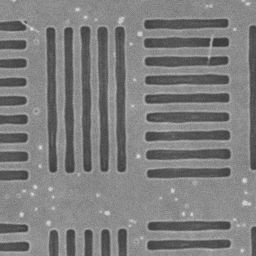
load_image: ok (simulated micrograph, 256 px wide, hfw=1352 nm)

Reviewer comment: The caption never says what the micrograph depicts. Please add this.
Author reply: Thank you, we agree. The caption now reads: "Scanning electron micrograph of groups of lines, slits or small figures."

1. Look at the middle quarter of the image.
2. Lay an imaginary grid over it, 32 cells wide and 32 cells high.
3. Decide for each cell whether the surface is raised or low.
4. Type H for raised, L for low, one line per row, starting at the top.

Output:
LLHHLLLHLLLHHLLHHHHHHLLLLLLLLLLL
LLHHLLLHLLLHHLLHHHHHHHHHHHHHHHHH
LLHHLLLHLLLHHLLLHHHHHHHHHHHHHHHH
LLHHLLLHHLLHHLLLHHHHLLLLLLLLLLLL
LLHHLLLHHLLHHLLHHHHHLLLLLLLLLLLL
LLHHLLLHHLLHHLLHHHHHHHHHLLHHHHHH
LLHHLLLHHLLHHLLLHHHHHHHHHHHHHHHH
LLHHHLLHHLLHHLLLHHHHHLLLLLLLLLLL
LLHHHLLHHLLHHLLHHHHHLLLLLLLLLLLL
LLHHHLLHHLLHHLLHHHHHLLLLLLLLLLLL
LLHHHLLHHLLHHLLHHHHHHHHHHHHHHHHH
LLHHHLLHHLLHHLLHHHHHHHHHHHHHHHHH
LLLHHLLHHLLHHLLHHHHHHLLLLLLLLLLL
LLLHLLLHHLLHHLLHHHHHLLLLLLLLLLLL
LLLHLLLHHLLHHLLHHHHHHLLLLLLLLLLL
LLLHHLLHHLLHHLLHHHHHHHHHHHHHHHHH
LLLHHLLHHLLHHLLLHHHHHHHHHHHHHHHH
LLLHHLLHHLLHHLLLHHHHLLLLLLLLLLLL
LLLHHLLHHLLHHLLLHHHHLLLLLLLLLLLL
LLLHHLLHHLLHHLLLHHHHHLHHHHHHHHHH
LLLHHLLHHLLHHLLLHHHHHHHHHHHHHHHH
LLLHHLLHHLLHHLLLHHHHHLLLLLLLLLLL
LLLHHLLHHLLHHLLLHHHHLLLLLLLLLLLL
LLLHHLLHHLLHHLLLHHHHHLLLLLLLLLLL
LLLHHLLHHLLHHLLLHHHHHHHHHHHHHHHH
LLLHHLLHHLLHHLLLHHHHHHHHHHHHHHHH
LLLHHLLHHLLHHLLHHHHHHLLLLLLLLLLL
HHHHHHHHHHHHHHHHHHHHHLLLLLLLLLLL
HHHHHHHHHHHHHHHHHHHHHLLLLLLLHHHH
HHHHHHHHHHHHHHHHHHHHHHHHHHHHHHHH
HHHHHHHHHHHHHHHHHHHHHHHHHHHHHHHH
HHHHHHHHHHHHHHHHHHHHHHHHHHHHHHHH